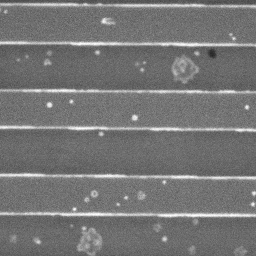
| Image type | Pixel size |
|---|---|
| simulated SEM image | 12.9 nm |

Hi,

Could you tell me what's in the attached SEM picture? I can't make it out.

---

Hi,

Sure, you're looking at lines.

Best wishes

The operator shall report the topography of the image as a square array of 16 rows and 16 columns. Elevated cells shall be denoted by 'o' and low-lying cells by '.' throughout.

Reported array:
oooooooooooooooo
oooooooooooooooo
oooooooooooooooo
................
................
................
oooooooooooooooo
oooooooooooooooo
................
................
................
oooooooooooooooo
oooooooooooooooo
................
................
................